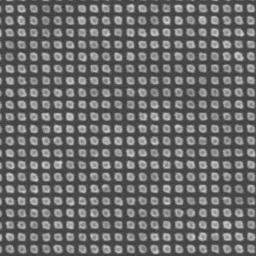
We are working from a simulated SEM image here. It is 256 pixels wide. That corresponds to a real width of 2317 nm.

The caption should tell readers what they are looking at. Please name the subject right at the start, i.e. a regular array of raised bodies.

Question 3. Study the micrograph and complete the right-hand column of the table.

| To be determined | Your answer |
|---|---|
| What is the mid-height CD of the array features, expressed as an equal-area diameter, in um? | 0.0677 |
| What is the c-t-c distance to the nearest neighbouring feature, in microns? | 0.106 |